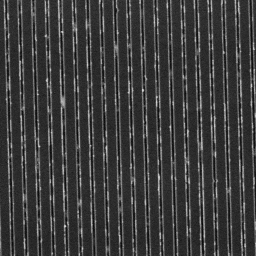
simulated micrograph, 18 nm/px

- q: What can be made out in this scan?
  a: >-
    parallel lines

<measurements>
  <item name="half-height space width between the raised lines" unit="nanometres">182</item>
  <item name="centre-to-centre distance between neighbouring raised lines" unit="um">0.244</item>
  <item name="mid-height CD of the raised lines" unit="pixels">3.25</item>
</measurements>